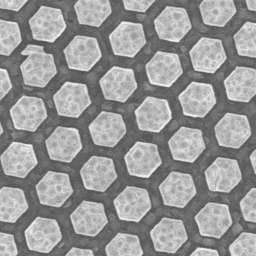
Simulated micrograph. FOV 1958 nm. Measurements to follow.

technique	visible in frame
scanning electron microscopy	a regular array of raised bodies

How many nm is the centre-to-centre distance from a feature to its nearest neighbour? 348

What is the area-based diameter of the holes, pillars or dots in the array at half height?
265 nanometers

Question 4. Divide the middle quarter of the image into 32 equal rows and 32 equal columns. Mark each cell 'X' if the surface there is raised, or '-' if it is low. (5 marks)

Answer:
-XXXXXX--------------XXXXXXXX---
-----X------XXXXX----XXXXXXXX---
-----------XXXXXX----XXXXXXXX---
----------XXXXXXXX---XXXXXXX----
---------XXXXXXXXX----XXXXXX----
XXXXX-----XXXXXXXX-------XX----X
XXXXXX----XXXXXXXX------------XX
XXXXXX----XXXXXXX------------XXX
XXXXXX----XXXXXX-----X-------XXX
XXXXXX--------------XXXXXX---XXX
XXXXXX-------------XXXXXXX---XXX
XXXXX-------------XXXXXXXX----XX
XXXX-----XXXX-----XXXXXXXXX---XX
--------XXXXXXX---XXXXXXXXX-----
-------XXXXXXXX----XXXXXXX------
------XXXXXXXXX----XXXXXX-------
XXX---XXXXXXXXX-----XXXX-----XXX
XXX----XXXXXXXX-------------XXXX
XXXX---XXXXXXX-------------XXXXX
XXXX---XXXXXX-------------XXXXXX
XXXX------XX-----XXXXXX----XXXXX
XXXX-------------XXXXXX----XXXXX
XXX-------------XXXXXXXX---XXXXX
XX-----XXX-----XXXXXXXXX---XXXXX
------XXXXXX---XXXXXXXXX--------
-----XXXXXXX----XXXXXXXX--------
----XXXXXXXXX---XXXXXXX---------
----XXXXXXXXX----XXXXX----XXXX--
X----XXXXXXXX-------------XXXXXX
X----XXXXXXX-------------XXXXXXX
XX---XXXXXX-------------XXXXXXXX
XX------XX-----XXXXX----XXXXXXXX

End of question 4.